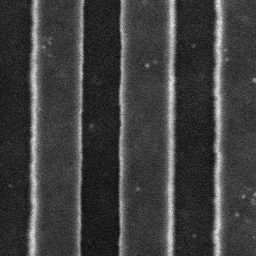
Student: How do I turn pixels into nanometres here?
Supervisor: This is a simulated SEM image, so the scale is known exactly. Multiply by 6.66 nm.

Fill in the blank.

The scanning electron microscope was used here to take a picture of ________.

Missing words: lines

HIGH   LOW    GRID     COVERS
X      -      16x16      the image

--XXX---XXX---XX
--XXX---XXX---XX
--XXX---XXX---XX
--XXX---XXX---XX
--XXX---XXX---XX
--XXX---XXX---XX
--XXX---XXX---XX
--XXX---XXX---XX
--XXX---XXX---XX
--XXX--XXXX---XX
--XXX---XXX---XX
--XXX--XXXX---XX
--XXX--XXXX---XX
--XXX---XXX---XX
--XXX--XXXX---XX
--XXX--XXXX---XX